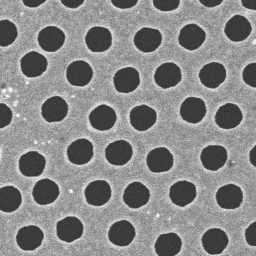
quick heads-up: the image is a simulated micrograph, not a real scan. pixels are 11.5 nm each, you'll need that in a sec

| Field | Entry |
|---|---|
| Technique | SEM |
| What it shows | a regular array of holes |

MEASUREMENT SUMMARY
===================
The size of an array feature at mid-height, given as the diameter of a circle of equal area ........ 0.306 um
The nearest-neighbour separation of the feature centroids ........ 460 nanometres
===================